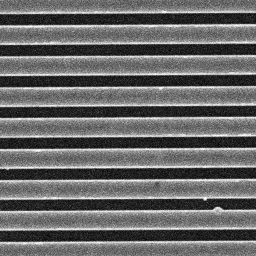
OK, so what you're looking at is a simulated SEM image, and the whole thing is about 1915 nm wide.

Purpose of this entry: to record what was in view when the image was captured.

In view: parallel lines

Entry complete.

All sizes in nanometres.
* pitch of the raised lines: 231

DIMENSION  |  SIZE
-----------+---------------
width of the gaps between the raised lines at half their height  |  87.8 nm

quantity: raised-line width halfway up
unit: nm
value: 139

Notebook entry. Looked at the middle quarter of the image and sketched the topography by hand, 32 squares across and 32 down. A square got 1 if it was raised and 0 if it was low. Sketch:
11111111111111111111111111111111
11111111111111111111111111111111
11111111111111111111111111110000
00000000000000000000000000000000
00000000000000000000000000000000
00000000000000000000000000000000
11111111111111111111111111111111
11111111111111111111111111111111
11111111111111111111111111111111
11111111111111111111111111111111
00000000000000000000000000000000
00000000000000000000000000000000
00000000000000000000000000000000
00000000000000000000000000011111
11111111111111111111111111111111
11111111111111111111111111111111
11111111111111111111111111111111
11111111111111111111111111111111
00000000000000000000000000000000
00000000000000000000000000000000
00000000000000000000000000000000
11111111111111111111111111111111
11111111111111111111111111111111
11111111111111111111111111111111
11111111111111111111111111111111
11111111111111111111111111111111
00000000000000000000000000000000
00000000000000000000000000000000
00000000000000000000000000000000
11111111111111111111111111111111
11111111111111111111111111111111
11111111111111111111111111111111